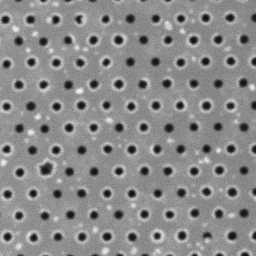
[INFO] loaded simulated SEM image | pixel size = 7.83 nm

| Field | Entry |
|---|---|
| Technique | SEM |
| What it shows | a regular array of holes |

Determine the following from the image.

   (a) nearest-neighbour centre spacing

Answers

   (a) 190 nm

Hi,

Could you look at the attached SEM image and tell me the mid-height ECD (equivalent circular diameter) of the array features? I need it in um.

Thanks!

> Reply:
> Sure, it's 0.0723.